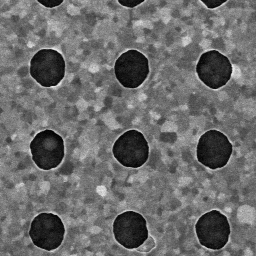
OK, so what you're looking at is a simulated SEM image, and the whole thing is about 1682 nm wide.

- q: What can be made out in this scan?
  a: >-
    a regular array of holes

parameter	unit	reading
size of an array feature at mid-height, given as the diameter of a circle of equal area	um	0.243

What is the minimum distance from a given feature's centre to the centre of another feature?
528 nanometers